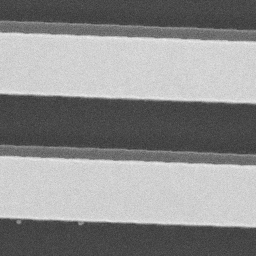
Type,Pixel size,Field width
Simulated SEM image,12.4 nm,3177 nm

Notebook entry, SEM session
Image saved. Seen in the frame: lines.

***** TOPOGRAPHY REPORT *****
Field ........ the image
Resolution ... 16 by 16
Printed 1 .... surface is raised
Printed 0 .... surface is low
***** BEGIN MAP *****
0000000000000000
1111100000000000
1111111111111111
1111111111111111
1111111111111111
1111111111111111
0000000000000000
0000000000000000
0000000000000000
1111111111100000
1111111111111111
1111111111111111
1111111111111111
1111111111111111
0000000000000000
0000000000000000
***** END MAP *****